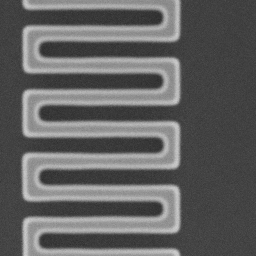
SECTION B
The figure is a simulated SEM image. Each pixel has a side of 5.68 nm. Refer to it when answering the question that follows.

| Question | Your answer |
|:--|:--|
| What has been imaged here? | groups of lines, slits or small figures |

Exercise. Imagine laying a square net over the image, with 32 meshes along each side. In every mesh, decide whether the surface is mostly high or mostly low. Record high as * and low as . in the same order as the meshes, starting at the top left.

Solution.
...*******************..........
....................**..........
.....................*..........
....******************..........
...*******************..........
...**...........................
...**...........................
...*******************..........
...*******************..........
....................**..........
.....................*..........
...*******************..........
...*******************..........
...**...........................
...**...........................
...*******************..........
...*******************..........
....................**..........
.....................*..........
...*******************..........
...*******************..........
...**...........................
...**...........................
...*******************..........
...*******************..........
....................**..........
.....................*..........
...*******************..........
...*******************..........
...**...........................
...**...........................
...*******************..........